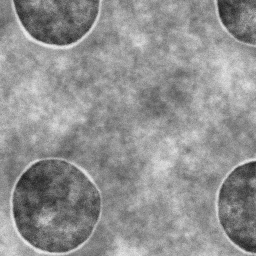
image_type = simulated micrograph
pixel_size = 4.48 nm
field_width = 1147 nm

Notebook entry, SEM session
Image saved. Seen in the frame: holes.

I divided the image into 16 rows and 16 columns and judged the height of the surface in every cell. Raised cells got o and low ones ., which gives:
o.....oooooooo..
o.....oooooooo..
oo...oooooooooo.
oooooooooooooooo
oooooooooooooooo
oooooooooooooooo
oooooooooooooooo
oooooooooooooooo
oooooooooooooooo
oooooooooooooooo
oo...oooooooooo.
o.....oooooooo..
o.....oooooooo..
o.....oooooooo..
o.....oooooooo..
oo...oooooooooo.